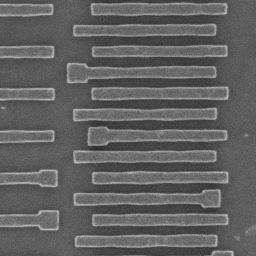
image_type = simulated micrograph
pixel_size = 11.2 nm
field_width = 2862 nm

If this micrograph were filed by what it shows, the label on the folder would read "wiring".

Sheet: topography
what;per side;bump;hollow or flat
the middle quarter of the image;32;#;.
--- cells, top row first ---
.#####..........................
.###############################
.###############################
.##########.....................
.####...........................
................................
.......#########################
.......#########################
.......#########################
................................
................................
...#############################
...#############################
...#############################
................................
................................
......###########........####...
......##########################
......##########################
......######....................
................................
................................
...#############################
...#############################
...########################....#
................................
................................
.......#########################
.......#########################
.......##################..####.
................................
................................